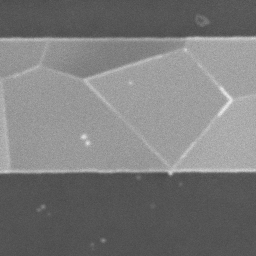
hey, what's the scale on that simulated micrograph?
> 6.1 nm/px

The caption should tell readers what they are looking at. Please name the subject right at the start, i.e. wiring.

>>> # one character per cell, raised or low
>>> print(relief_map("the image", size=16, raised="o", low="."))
................
................
oooooooooooooooo
oooooooooooooooo
oooooooooooooooo
oooooooooooooooo
oooooooooooooooo
oooooooooooooooo
oooooooooooooooo
oooooooooooooooo
oooooooooooooooo
................
................
................
................
................